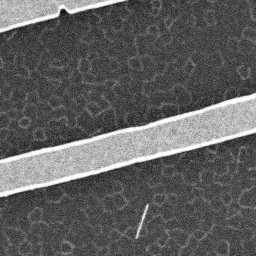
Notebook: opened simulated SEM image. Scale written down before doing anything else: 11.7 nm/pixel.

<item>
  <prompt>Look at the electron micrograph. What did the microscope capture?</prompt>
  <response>one or a few lines or trenches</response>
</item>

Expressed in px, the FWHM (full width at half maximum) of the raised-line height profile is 32.7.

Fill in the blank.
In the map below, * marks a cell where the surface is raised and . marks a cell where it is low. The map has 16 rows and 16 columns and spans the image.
*****...........
*...............
................
................
................
................
..............**
..........******
.......********.
..*********.....
*******.........
***.............
................
................
................
................